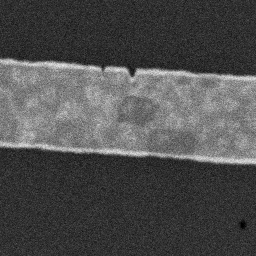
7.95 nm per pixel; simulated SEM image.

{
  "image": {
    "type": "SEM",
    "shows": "one or a few lines or trenches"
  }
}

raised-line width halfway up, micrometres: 0.652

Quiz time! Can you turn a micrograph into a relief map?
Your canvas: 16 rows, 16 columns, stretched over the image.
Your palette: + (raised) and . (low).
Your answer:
................
................
................
................
++++++++.+......
++++++++++++++++
++++++++++++++++
++++++++++++++++
++++++++++++++++
.......+++++++++
................
................
................
................
................
................